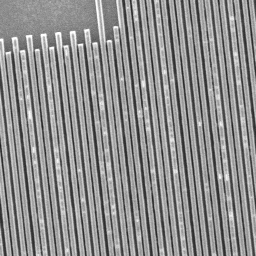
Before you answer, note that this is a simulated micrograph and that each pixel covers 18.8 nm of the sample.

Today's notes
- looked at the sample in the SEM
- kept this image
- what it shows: parallel lines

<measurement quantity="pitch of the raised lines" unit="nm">137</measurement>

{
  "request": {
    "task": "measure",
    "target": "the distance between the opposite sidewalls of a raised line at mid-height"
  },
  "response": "88.9 nanometers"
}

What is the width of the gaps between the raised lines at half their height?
53.8 nanometers